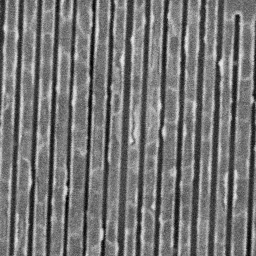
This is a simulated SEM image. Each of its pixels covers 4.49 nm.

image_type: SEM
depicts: parallel lines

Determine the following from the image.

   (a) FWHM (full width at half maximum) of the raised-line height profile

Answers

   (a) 56.7 nm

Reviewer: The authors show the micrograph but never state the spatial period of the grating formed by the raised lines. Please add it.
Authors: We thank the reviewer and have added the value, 0.0815 microns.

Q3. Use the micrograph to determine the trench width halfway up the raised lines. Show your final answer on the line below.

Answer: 23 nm